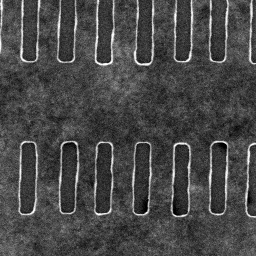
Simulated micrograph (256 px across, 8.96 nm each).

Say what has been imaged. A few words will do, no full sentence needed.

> holes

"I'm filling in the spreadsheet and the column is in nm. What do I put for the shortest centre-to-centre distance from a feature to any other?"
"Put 336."